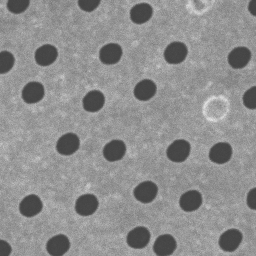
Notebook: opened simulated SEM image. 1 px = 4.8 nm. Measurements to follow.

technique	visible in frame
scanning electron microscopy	a regular array of holes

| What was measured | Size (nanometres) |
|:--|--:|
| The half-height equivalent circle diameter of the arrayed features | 107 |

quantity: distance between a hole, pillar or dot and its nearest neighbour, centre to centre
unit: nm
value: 228